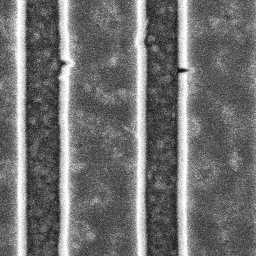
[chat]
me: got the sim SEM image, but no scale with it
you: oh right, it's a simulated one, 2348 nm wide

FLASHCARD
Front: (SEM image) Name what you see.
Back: one or a few lines or trenches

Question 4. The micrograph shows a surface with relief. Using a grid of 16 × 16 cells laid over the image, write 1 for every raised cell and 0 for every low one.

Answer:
1000111110011111
1000111110011111
1000111110011111
1000111110011111
1000111110001111
1000111110011111
1000111110011111
1000111110011111
1000111110011111
1000111110011111
1000111110011111
1000111110011111
1000111110011111
1000111110011111
1000111110011111
1000111110011111